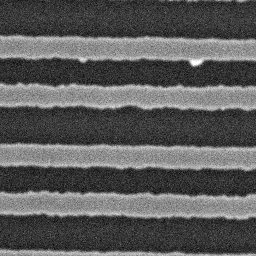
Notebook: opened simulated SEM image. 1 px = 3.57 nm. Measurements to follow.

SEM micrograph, lines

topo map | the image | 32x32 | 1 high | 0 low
00000000000000000000000000000000
00000000000000000000000000000000
00000000000000000000000000000000
00000000000000000000000000000000
00000000000000000000000000000000
11111111111111111111111111111111
11111111111111111111111111111111
00000000000000000000010111000001
00000000000000000000000000000000
00000000000000000000000000000000
00000000000000000000000000000000
11111111111111111111111111111111
11111111111111111111111111111111
00000000000000000010001011110011
00000000000000000000000000000000
00000000000000000000000000000000
00000000000000000000000000000000
00000000000000000000000000000000
11111111111111111111111111111101
11111111111111111111111111111111
11111111111111111111111111111111
00000000000000000000000000000000
00000000000000000000000000000000
00000000000000000000000000000000
11111111111111111111111000000001
11111111111111111111111111111111
11111111111111111111111111111111
00000000000000000000000000000000
00000000000000000000000000000000
00000000000000000000000000000000
00000000000000000000000000000000
11111110000000000000000000000000